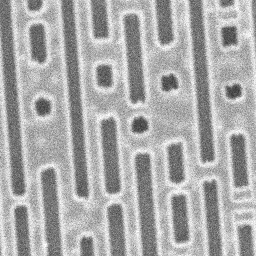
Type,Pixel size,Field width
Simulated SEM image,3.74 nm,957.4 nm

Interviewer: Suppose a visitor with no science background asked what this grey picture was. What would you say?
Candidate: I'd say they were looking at parallel lines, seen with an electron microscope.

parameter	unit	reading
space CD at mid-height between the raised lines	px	17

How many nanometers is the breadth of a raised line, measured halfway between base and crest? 54.5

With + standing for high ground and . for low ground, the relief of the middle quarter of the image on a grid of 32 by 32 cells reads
....++++....+++.....++++++++++++
....++++....+++.....++++++++++++
....++++....++++....++++++.+++++
....++++....++++....++++....++++
+...++++....++++.....+++.....+++
+...++++....++++.....+++.....+++
+....+++++++++++.....+++...+++++
+....+++++++++++.....+++++++++++
+....+++++++++++.....+++++++++++
+....+++++++++++....++++++++++++
+....+++++++++++++++++++++++++++
+....+++++++++++++++++++++++++++
+....+++++++++++++++++++++++++++
+....+++++...++++...++++++++++++
+....++++....++++....+++++++++++
+....++++....++++....+++++++++++
+....++++....++++....+++++++++++
++...++++....++++++.++++++++++++
++...++++.....++++++++++++++++++
++....+++.....+++++++++++++..+++
++....+++.....+++++++++++.....++
++....+++.....+++++++++++.....++
++....+++.....++++....+++.....++
++....+++.....+++.....+++.....++
++....+++.....+++.....++++....++
++....+++.....+++.....++++....++
++....++++....+++.....++++....++
++....++++....+++.....++++....++
++....++++....++++....++++.....+
+++...++++....++++.....+++....++
+++...++++.....+++.....+++++++++
+++...++++....++++.....+++++++++